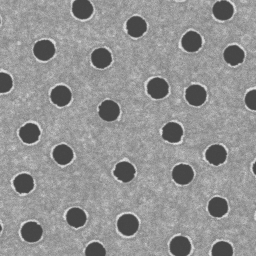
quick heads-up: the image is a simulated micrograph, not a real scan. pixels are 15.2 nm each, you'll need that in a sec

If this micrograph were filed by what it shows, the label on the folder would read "a regular array of holes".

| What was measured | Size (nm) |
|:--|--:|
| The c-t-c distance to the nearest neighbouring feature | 715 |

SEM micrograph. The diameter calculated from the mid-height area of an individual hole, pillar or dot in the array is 0.312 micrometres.